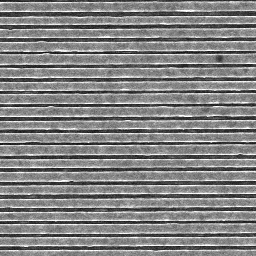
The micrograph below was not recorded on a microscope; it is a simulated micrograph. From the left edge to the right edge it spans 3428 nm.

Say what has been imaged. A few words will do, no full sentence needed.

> parallel lines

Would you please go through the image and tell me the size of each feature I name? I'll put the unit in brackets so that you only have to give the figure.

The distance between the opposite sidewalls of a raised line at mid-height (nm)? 122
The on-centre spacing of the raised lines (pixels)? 13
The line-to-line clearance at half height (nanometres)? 55.2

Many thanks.